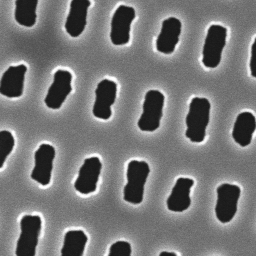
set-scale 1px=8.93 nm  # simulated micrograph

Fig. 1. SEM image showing a regular array of holes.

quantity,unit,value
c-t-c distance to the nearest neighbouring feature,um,0.417